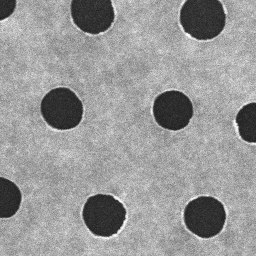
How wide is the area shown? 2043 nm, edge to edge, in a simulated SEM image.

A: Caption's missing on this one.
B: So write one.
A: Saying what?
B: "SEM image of holes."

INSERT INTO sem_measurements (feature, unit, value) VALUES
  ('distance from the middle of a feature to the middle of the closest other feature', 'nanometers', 846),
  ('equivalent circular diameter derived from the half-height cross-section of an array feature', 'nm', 336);